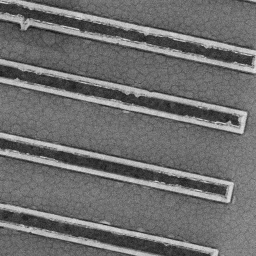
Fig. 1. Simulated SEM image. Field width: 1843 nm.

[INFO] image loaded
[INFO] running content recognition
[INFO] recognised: one or a few lines or trenches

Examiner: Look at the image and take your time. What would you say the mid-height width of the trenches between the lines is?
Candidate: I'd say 51.2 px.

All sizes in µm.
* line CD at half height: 0.135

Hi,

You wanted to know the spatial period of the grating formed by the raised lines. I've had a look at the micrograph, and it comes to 482 nanometres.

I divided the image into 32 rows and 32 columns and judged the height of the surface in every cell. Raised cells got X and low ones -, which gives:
XXX-----------------------------
XXXXXXXX------------------------
--XXXXXXXXXXX-------------------
-------XXXXXXXXXX---------------
-----------XXXXXXXXXXX----------
----------------XXXXXXXXXXX-----
---------------------XXXXXXXXXX-
-------------------------XXXXXXX
XXXX--------------------------XX
XXXXXXXX------------------------
--XXXXXXXXXXX-------------------
-------XXXXXXXXXXX--------------
------------XXXXXXXXXXX---------
----------------XXXXXXXXXXX-----
---------------------XXXXXXXXXX-
--------------------------XXXX--
--------------------------------
XXX-----------------------------
XXXXXXXX------------------------
--XXXXXXXXXXX-------------------
-------XXXXXXXXXX---------------
------------XXXXXXXXXX----------
-----------------XXXXXXXXXX-----
---------------------XXXXXXXX---
--------------------------XXX---
--------------------------------
XXXX----------------------------
XXXXXXXXX-----------------------
--XXXXXXXXXXX-------------------
-------XXXXXXXXXXX--------------
------------XXXXXXXXXXX---------
----------------XXXXXXXXXXX-----